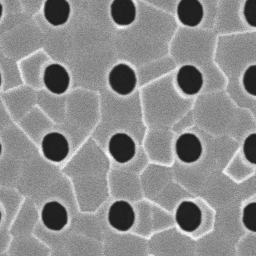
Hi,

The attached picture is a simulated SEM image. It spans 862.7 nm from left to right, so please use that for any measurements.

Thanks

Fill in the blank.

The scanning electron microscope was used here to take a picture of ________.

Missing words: a regular array of holes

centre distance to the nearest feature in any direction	225	nanometres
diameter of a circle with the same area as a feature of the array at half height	92.9	nanometers